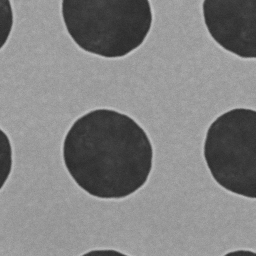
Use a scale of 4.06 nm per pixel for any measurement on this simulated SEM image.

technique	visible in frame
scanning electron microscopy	holes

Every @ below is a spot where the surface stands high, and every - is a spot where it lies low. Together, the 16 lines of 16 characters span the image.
-@@@-----@@@@---
-@@@-----@@@@---
@@@@@----@@@@---
@@@@@@-@@@@@@@@-
@@@@@@@@@@@@@@@@
@@@@@@@@@@@@@@@@
@@@@@@@@@@@@@@@@
@@@@@---@@@@@@--
@@@@-----@@@@---
-@@@-----@@@@---
-@@@-----@@@@---
@@@@@----@@@@@--
@@@@@@@@@@@@@@@@
@@@@@@@@@@@@@@@@
@@@@@@@@@@@@@@@@
@@@@@@@@@@@@@@@@